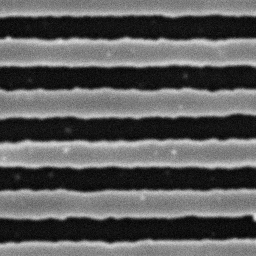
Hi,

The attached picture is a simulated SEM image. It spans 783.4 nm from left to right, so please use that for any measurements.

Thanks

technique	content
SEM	lines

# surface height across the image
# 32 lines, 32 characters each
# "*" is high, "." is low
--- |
********************************
********************************
................................
................................
................................
********************************
********************************
********************************
................................
................................
................................
**************************.*****
********************************
********************************
********.*********..***.*.......
................................
................................
..........................*.**.*
********************************
********************************
********************************
................................
................................
................................
********************************
********************************
********************************
................................
................................
................................
********************************
********************************